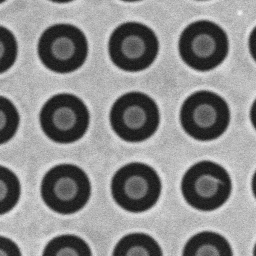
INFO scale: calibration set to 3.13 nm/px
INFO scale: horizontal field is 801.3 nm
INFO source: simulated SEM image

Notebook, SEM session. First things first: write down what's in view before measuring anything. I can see an array of small figures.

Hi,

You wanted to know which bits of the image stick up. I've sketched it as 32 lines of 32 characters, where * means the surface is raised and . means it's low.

********************************
********************************
*************************.******
.*****....****.....****.....****
..***......***......**......***.
..***......**.......**.......**.
..***......**.......**.......**.
..***......***.....****.....****
.*****....*****...******...*****
********************************
********************************
****************..******...*****
.*****....****.....****.....****
..***......***......***......**.
..***......***......**.......**.
..***......***......***......**.
..***......***.....****.....****
.*****....*****...******...*****
********************************
********************************
*******..*******..******...*****
..****.....***......***.....****
..***......***......***......**.
...**......***......**.......**.
...**......***......***......***
..****.....****....****.....****
.******...******..**************
********************************
********************************
.******...*****....*****....****
..****.....***......***......***
...**......***......***......***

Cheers